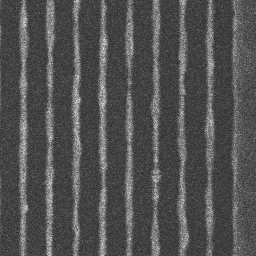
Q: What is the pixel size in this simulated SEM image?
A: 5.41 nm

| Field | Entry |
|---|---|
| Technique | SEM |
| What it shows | parallel lines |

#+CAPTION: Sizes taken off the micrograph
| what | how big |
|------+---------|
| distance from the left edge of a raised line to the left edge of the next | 144 nm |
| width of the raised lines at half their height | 28.4 nm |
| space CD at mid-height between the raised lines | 119 nm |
